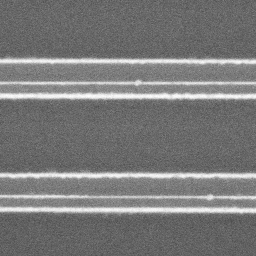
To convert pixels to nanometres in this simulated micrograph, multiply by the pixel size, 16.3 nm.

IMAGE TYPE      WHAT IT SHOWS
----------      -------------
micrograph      lines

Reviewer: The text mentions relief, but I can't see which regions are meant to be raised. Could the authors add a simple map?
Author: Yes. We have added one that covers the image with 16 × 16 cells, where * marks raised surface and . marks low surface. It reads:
................
................
................
................
****************
****************
................
................
................
................
................
****************
****************
................
................
................